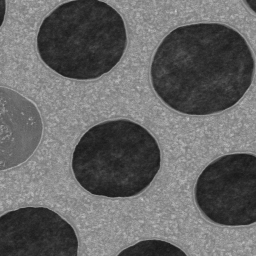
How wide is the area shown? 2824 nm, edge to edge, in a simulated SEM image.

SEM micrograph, holes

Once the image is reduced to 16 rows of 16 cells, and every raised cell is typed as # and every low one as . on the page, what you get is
####...#########
###.....####..##
##......##.....#
###.....##......
####...##.......
##########......
.#########.....#
..##############
..###....#######
.####.....######
#####.....###...
#####....###....
############....
....#########...
.....###########
.....###...#####